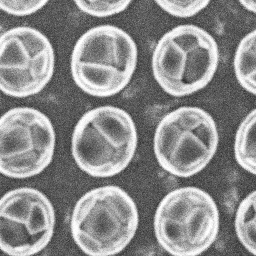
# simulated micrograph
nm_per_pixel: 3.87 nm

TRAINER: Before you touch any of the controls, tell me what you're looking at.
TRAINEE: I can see raised bodies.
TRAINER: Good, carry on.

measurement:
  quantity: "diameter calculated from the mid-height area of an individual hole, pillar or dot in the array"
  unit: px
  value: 62.7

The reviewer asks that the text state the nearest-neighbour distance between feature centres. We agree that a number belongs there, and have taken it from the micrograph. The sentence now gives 311 nanometres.